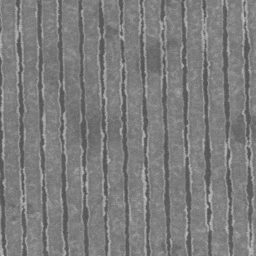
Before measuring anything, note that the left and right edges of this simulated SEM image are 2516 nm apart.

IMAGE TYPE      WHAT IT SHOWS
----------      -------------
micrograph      parallel lines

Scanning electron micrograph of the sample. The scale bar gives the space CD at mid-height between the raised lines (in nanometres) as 36.8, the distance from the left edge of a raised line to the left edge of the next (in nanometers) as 203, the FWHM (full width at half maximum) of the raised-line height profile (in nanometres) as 162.